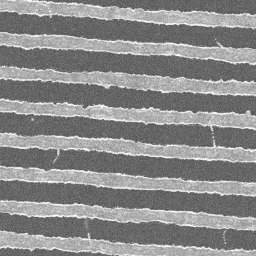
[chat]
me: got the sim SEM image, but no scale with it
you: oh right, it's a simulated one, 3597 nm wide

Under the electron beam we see parallel lines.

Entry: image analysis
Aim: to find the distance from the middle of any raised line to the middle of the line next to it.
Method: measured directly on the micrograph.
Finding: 470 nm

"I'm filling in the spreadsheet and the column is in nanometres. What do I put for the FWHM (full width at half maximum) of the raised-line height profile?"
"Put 172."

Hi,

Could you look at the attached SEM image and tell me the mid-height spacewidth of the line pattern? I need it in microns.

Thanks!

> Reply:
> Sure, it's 0.305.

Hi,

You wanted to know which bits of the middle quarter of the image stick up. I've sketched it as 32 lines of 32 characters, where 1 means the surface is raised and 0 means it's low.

00000000000000000000000000000000
00000000000000000000000000000000
11111111111111110000000000000000
11111111111111111111111111000100
01111111111111111111111111111111
00000000000000111111111111111111
00000000000000000000101111111111
00000000000000000000000000000000
00000000000000000000000000000000
00000000000000000000000000000000
11110000110000000000000000000000
11111111111111110111111100000000
11111111111111111111111111111111
00000000111111111111111111111111
00000000000000000000111111111111
00000000000000000000000000000000
00000000000000000000000000000000
00000000000000000000000000000000
11110000000000000000000000000000
11111111111111111000000000000000
11111111111111111111111001111000
00000010111111111111111111111111
00000000000000010111111111111111
00000000000000000000000000000111
00000000000000000000000000000000
00000000000000000000000000000000
00000000000000000000000000000000
11111111111110000000000000000000
11111111111111111111100000000000
11111111111111111111111111111111
00000000011111111111111111111111
00000000000000000000000001111111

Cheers